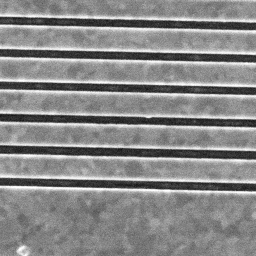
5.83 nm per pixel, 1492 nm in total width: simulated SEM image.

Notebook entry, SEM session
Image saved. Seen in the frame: parallel lines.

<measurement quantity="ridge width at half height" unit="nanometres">138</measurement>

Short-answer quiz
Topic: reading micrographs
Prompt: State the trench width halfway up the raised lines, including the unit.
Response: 50.3 nm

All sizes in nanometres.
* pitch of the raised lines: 188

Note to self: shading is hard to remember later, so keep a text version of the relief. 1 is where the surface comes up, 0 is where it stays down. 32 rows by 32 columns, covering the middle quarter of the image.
11111111111111111111111111111111
11111111111111111111111111111111
11111111111111111111111111111111
11111111111111111111111111111111
11111111111111111111111111111111
00000000000000000000000000000000
00000000000000000000000000000000
11111111111111111111111111100000
11111111111111111111111111111111
11111111111111111111111111111111
11111111111111111111111111111111
11111111111111111111111111111111
11111111111111111111111111111111
00000000000000000000000000000000
00000000000000000000000000000000
11111111111111111111111000000000
11111111111111111111111111111111
11111111111111111111111111111111
11111111111111111111111111111111
11111111111111111111111111111111
00111111111111111111111111111111
00000000000000000000000000000000
00000000000000000000000000000000
11111111111111111110000000000000
11111111111111111111111111111111
11111111111111111111111111111111
11111111111111111111111111111111
11111111111111111111111111111111
11111111111111111111111111111111
00000000000000000000000000000000
00000000000000000000000000000000
11111111111111100000000000000000